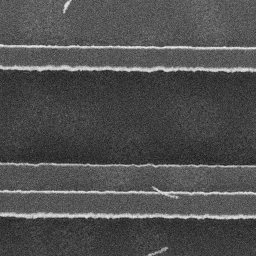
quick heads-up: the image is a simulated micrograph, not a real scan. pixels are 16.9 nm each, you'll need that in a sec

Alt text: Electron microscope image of lines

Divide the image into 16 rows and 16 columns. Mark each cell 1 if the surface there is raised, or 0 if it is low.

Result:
1111111111111111
1111111111111111
1111111111111111
1111111111111111
0000000000000000
0000000000000000
0000000000000000
0000000000000000
0000000000000000
0000000000000000
1111111111111111
1111111111111111
1111111111111111
0100101111111111
0000000000000000
0000000000000000